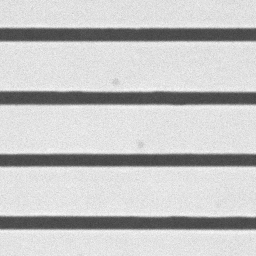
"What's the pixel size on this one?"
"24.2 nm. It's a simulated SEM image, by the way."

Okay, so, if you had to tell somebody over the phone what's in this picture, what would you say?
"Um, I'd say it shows lines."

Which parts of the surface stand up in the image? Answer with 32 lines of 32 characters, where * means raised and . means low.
********************************
********************************
********************************
.................*..............
................................
********************************
********************************
********************************
********************************
********************************
********************************
................................
................................
********************************
********************************
********************************
********************************
********************************
********************************
................................
................................
********************************
********************************
********************************
********************************
********************************
********************************
................................
................................
********************************
********************************
********************************